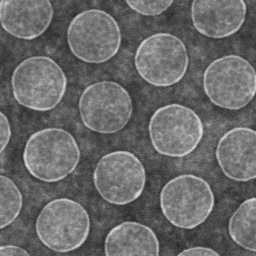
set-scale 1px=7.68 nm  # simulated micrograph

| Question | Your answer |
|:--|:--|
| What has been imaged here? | a regular array of raised bodies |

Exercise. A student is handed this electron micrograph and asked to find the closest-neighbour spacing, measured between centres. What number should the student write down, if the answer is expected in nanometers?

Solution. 550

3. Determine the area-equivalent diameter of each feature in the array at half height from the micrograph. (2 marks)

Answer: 0.398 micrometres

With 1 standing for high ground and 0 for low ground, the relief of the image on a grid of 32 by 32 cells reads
11111100000000001111100011111100
11111100000110000111000011111110
11111100011111000000000011111100
01111100011111100000000001111100
00111000011111100001110000110000
00000000011111100011111000000000
00000000011111000111111000000000
00011100000110000111111000011100
00111110000000000111111000111111
00111111000000000011111000111111
00111111000011000001100000111111
00111111000111110000000000111111
00111110001111110000000000011110
00001100001111110000011000001100
10000000001111110001111110000000
10000000000111110001111110000000
10000111000001000001111110000111
10001111100000000001111110001111
00011111110000000000111100011111
00011111110001111000000000011111
00011111110011111100000000001111
00001111100011111100000000001111
10000010000011111100001110000010
11000000000011111100011111000000
11000000000001111000111111100000
11100011110000000000111111100011
11000111111000000000111111000011
11000111111000000000011110000111
00000111111000011100000000000111
00000111111000111110000000000111
00000011110001111111000000000011
11100000000001111111000111100000